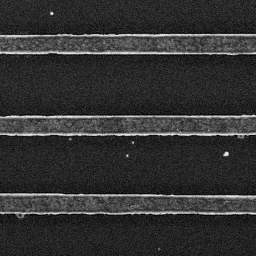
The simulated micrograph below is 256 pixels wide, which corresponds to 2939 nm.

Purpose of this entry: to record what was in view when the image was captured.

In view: lines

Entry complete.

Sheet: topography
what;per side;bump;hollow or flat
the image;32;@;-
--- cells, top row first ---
--------------------------------
--------------------------------
--------------------------------
--------------------------------
@@@@@@@@@@@@@@@@@@@@@@@@@@@@@@@@
@@@@@@@@@@@@@@@@@@@@@@@@@@@@@@@@
@@@@@@@@@@@@@@@@@@@@@@@@@@@@@@@@
--------------------------------
--------------------------------
--------------------------------
--------------------------------
--------------------------------
--------------------------------
--------------------------------
--------------------------------
@@@@@@@@@@@@@@@@@@@@@@@@@@@@@@@@
@@@@@@@@@@@@@@@@@@@@@@@@@@@@@@@@
--------------------------------
--------------------------------
--------------------------------
--------------------------------
--------------------------------
--------------------------------
--------------------------------
@@@@@@@@@@@@@@@@@@@@------------
@@@@@@@@@@@@@@@@@@@@@@@@@@@@@@@@
@@@@@@@@@@@@@@@@@@@@@@@@@@@@@@@@
--------------------------------
--------------------------------
--------------------------------
--------------------------------
--------------------------------